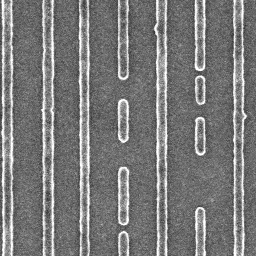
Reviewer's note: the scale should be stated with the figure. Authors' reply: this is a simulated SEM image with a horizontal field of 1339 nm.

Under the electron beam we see parallel lines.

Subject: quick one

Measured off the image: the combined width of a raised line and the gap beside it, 202 nm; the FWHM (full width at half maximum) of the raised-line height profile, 49 nanometres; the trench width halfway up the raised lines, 156 nanometers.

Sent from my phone